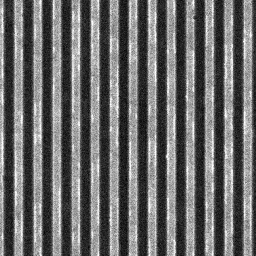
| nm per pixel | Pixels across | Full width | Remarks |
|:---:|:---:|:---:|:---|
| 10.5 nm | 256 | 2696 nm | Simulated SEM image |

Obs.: parallel lines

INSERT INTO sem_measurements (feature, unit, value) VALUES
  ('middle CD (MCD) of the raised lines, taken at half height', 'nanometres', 101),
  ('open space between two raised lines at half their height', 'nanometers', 101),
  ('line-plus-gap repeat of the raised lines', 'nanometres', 201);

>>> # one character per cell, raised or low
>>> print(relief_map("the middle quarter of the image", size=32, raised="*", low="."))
..**...**..***..**...**...**...*
..**...**..***..**...**...**...*
..**...**..***..**...**...**...*
..**...**..***..**...**...**...*
..**...**..***..**...**...**...*
..**...**..***..**...**...**...*
..**...**..***..**...**...**...*
..**...**..***..**...**...**...*
..**...**..***..**...**...**...*
..**...**..***..**...**...**...*
..**...**..***..**...**...**...*
..**...**..***..**...**...**...*
..**...**..***..**...**...**...*
..**...**..***..**...**...**...*
..**...**..***..**...**...**...*
..**...**..***..**...**...**...*
..**...**..***..**...**...**...*
..**...**..***..**...**...**...*
..**...**..***..**...**...**...*
..**...**..***..**...**...**...*
..**...**..***..**...**...**...*
..**...**..***..**...**...**...*
..**...**..***..**...**...**...*
..**...**..***..**...**...**...*
..**...**..***..**...**...**...*
..**...**..***..**...**...**...*
..**...**..***..**...**...**...*
..**...**..***..**...**...**...*
..**...**..***..**...**...**...*
..**...**..***..**...**...**...*
..**...**..***..**...**...**...*
..**...**..***..**...**...**...*